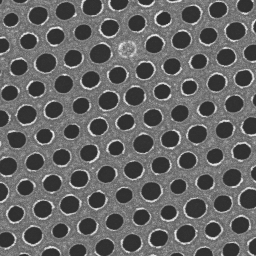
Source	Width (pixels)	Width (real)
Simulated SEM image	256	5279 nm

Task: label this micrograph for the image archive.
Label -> a regular array of holes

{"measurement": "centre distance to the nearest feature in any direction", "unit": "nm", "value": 563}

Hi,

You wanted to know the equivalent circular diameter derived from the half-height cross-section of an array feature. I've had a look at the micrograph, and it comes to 354 nm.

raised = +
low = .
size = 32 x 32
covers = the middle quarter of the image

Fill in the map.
+..++++++++++++++++...+++....+++
++++++++++++...+++....+++....+++
+++++...+++.....++....++++..++++
..++.....++.....+++..+++++++++++
..+++....+++...+++++++++++++++..
..+++...+++++++++++++++...++++..
..++++++++++++++....+++....+++..
++++++++++...++.....+++...++++..
++++.++++.....+.....+++...++++++
++....+++.....++....++++++++++++
++....+++....+++++++++++++++..++
++....+++++++++++++++..++++....+
++++++++++++++++++++....+++....+
++++++++++++++...+++.....++....+
+++++++...+++.....++....++++++++
+..+++.....++....++++..+++++++++
....+++....++++.+++++++++++++++.
....+++...+++++++++++++++...+++.
+..+++++++++++++++....++.....++.
++++++++++++..+++.....++.....+++
+++++...+++....++.....+++...++++
.+++....+++....+++...+++++++++++
.+++....++++..++++++++++++++++..
..++....+++++++++++++++..++++...
.++++++++++++++++.++++....+++...
++++++++++.++++.....++....+++...
+++++++++....++.....++....++++++
++....++.....++....+++++++++++++
++....++.....+++..++++++++++++++
++....++++..+++++++++++++++...++
++...+++++++++++++++....+++....+
++++++++++++++...++.....+++...++